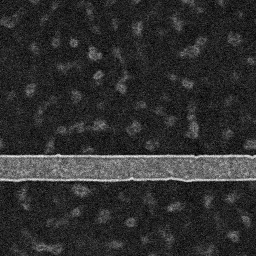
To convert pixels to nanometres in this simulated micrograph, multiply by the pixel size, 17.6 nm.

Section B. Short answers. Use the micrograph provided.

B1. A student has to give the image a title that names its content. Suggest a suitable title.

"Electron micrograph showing one or a few lines or trenches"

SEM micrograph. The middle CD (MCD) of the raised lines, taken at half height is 0.423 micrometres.